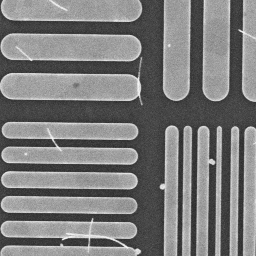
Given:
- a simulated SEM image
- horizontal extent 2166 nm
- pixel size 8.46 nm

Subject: groups of lines, slits or small figures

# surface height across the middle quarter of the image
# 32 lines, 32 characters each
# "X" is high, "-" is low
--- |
-------------------------XXXXXX-
-------------------------XXXXXX-
-------------------------XXXXXX-
XXXXXXXXXXXXXXXXXX-------XXXXXX-
XXXXXXXXXXXXXXXXXXX------XXXXXX-
XXXXXXXXXXXXXXXXXXX------XXXXXX-
XXXXXXXXXXXXXXXXXXX------XXXXXX-
XXXXXXXXXXXXXXXXXXX------XXXXXX-
XXXXXXXXXXXXXXXXXX--------XXXX--
--------------------------------
--------------------------------
--------------------------------
--------------------------------
--------------------------------
--------------------------------
XXXXXXXXXXXXXXXXXX--------------
XXXXXXXXXXXXXXXXXX-------XXX--XX
XXXXXXXXXXXXXXXXXX-------XXXX-XX
XXXXXXXXXXXXXXXXXX-------XXXX-XX
-------------------------XXXX-XX
-------------------------XXXX-XX
XXXXXXXXXXXXXXXXXX-------XXX--XX
XXXXXXXXXXXXXXXXXX-------XXX--XX
XXXXXXXXXXXXXXXXXX-------XXX--XX
XXXXXXXXXXXXXXXXXX-------XXX--XX
-------------------------XXX--XX
-------------------------XXX--XX
XXXXXXXXXXXXXXXXX--------XXX--XX
XXXXXXXXXXXXXXXXXX-------XXX--XX
XXXXXXXXXXXXXXXXXX-------XXX--XX
XXXXXXXXXXXXXXXXXX------XXXX--XX
-------------------------XXX--XX